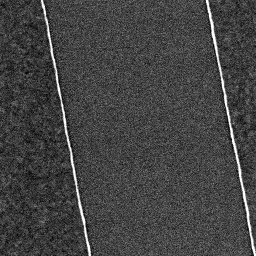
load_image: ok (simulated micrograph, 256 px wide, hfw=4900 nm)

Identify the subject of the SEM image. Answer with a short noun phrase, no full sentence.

one or a few lines or trenches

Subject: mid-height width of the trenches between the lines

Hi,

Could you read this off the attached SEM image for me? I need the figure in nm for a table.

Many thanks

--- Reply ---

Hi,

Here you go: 3100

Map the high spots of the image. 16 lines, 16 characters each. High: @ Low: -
@@@----------@@@
@@@----------@@@
@@@----------@@@
@@@-----------@@
@@@@----------@@
@@@@----------@@
@@@@----------@@
@@@@----------@@
@@@@-----------@
@@@@-----------@
@@@@@----------@
@@@@@----------@
@@@@@----------@
@@@@@-----------
@@@@@-----------
@@@@@@----------